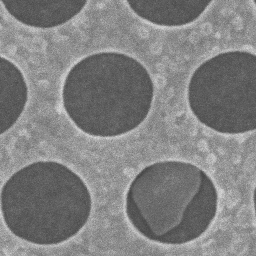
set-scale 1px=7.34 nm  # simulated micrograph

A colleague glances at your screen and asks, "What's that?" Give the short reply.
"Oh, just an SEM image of holes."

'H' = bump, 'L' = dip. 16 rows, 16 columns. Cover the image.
LLLLLHHHLLLLLHHH
HLLLHHHHHHLLHHHH
HHHHHHHHHHHHHHHH
HHHHHLLLHHHHHLLL
LHHHLLLLLHHHLLLL
LLHHLLLLLLHHLLLL
LLHHLLLLLHHHLLLL
LHHHLLLLLHHHLLLL
HHHHHHLHHHHHHHHH
HHHHHHHHHHHHHHHH
HLLLHHHHHLLLHHHH
LLLLLHHHLLLLLHHH
LLLLLLHHLLLLLLHH
LLLLLLHHLLLLLHHH
HLLLLHHHHLLLLHHH
HHHHHHHHHHHHHHHH